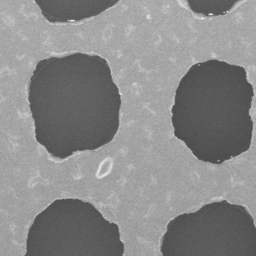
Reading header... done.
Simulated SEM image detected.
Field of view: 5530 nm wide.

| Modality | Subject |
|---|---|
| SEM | holes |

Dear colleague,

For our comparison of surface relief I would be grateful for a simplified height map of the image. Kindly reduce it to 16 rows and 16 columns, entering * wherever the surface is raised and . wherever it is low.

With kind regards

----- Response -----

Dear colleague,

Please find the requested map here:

**.....*****...*
****************
****************
****..**********
**.....*****...*
**.....****.....
**......***.....
**.....****.....
**.....****.....
***..*******...*
****************
****************
****.***********
**....*****.....
**.....***......
**......**......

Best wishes